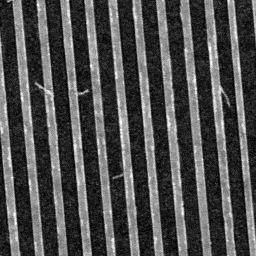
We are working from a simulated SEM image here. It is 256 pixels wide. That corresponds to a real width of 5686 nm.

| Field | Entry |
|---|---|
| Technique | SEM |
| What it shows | parallel lines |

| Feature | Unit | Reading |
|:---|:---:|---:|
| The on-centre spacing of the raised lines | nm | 526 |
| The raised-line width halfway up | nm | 177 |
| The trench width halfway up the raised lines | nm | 357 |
